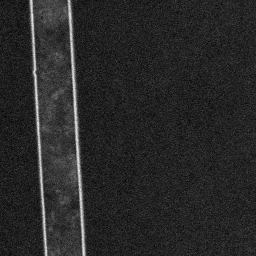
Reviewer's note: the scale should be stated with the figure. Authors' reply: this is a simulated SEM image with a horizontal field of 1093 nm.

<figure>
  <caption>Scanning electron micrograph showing one or a few lines or trenches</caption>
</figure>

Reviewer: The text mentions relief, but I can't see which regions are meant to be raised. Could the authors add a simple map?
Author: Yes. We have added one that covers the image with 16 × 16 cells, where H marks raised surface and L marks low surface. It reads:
HHLLHHHHHHHHHHHH
HHLLHHHHHHHHHHHH
HHLLHHHHHHHHHHHH
HHLLLHHHHHHHHHHH
HHLLLHHHHHHHHHHH
HHLLLHHHHHHHHHHH
HHLLLHHHHHHHHHHH
HHLLLHHHHHHHHHHH
HHLLLHHHHHHHHHHH
HHHLLHHHHHHHHHHH
HHHLLHHHHHHHHHHH
HHHLLHHHHHHHHHHH
HHHLLHHHHHHHHHHH
HHHLLHHHHHHHHHHH
HHHLLHHHHHHHHHHH
HHHLLHHHHHHHHHHH